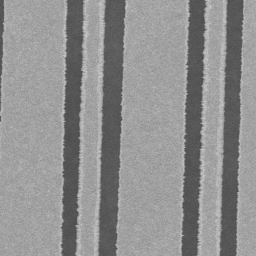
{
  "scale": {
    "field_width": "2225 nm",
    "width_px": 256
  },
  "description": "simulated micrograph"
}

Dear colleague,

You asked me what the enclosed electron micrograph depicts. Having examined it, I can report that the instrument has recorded lines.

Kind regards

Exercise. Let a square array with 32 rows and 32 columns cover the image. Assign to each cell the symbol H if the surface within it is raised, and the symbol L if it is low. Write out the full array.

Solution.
LHHHHHHHLLHHHLLLHHHHHHHHLLHHLLHH
LHHHHHHHLLHHHLLLHHHHHHHHLLHHLLHH
LHHHHHHHLLHHHLLLHHHHHHHHLLHHLLHH
LHHHHHHHLLHHHLLLHHHHHHHHLLHHLLHH
HHHHHHHHLLHHHLLLHHHHHHHHLLHHLLHH
HHHHHHHHLLHHHLLLHHHHHHHLLLHHLLHH
HHHHHHHHLLHHHLLLHHHHHHHLLHHHLLHH
HHHHHHHHLLHHHLLHHHHHHHHLLHHHLLHH
HHHHHHHHLLHHHLLHHHHHHHHLLLHHLLHH
HHHHHHHHLLHHHLLHHHHHHHHLLHHHLLHH
HHHHHHHHLLHHHLLHHHHHHHHLLHHHLLHH
HHHHHHHHLLHHHLLHHHHHHHHLLHHHLLHH
HHHHHHHHLLHHHLLHHHHHHHHLLHHHLLHH
HHHHHHHHLLHHHLLHHHHHHHHLLHHHLLHH
HHHHHHHHLLHHHLLHHHHHHHHLLHHHLLHH
HHHHHHHHLLHHHLLHHHHHHHHLLHHHLLHH
HHHHHHHHLLHHHLLHHHHHHHHLLHHHLLHH
HHHHHHHHLLHHHLLHHHHHHHHLLHHHLLHH
HHHHHHHHLLHHHLLHHHHHHHHLLHHHLLHH
HHHHHHHHLLHHHLLHHHHHHHHLLHHHLLHH
HHHHHHHHLLHHHLLHHHHHHHHLLHHHLLHH
HHHHHHHHLLHHHLLHHHHHHHHLLHHHLLHH
HHHHHHHHLLHHHLLHHHHHHHHLLHHHLLHH
HHHHHHHHLLHHHLLHHHHHHHHLLHHHLLHH
HHHHHHHHLLHHLLLHHHHHHHHLLHHHLLHH
HHHHHHHHLLHHLLLHHHHHHHHLLHHHLLHH
HHHHHHHHLLHHLLLHHHHHHHHLLHHHLLHH
HHHHHHHHLLHHLLLHHHHHHHHLLHHHLLHH
HHHHHHHHLLHHLLLHHHHHHHHLLHHHLLHH
HHHHHHHHLLHHLLLHHHHHHHHLLHHLLLHH
HHHHHHHHLLHHLLLHHHHHHHHLLHHLLLHH
HHHHHHHHLLHHLLLHHHHHHHHLLHHLLLHH